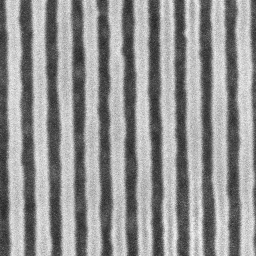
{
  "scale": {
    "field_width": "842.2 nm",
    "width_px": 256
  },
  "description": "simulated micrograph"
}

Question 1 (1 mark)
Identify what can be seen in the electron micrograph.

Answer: parallel lines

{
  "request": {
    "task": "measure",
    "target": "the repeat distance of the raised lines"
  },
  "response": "84.1 nm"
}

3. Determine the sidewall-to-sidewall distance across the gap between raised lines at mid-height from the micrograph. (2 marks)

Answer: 41.5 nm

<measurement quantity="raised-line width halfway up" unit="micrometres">0.0415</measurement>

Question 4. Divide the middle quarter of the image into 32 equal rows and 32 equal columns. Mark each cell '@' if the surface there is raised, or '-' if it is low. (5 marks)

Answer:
@@---@@@---@@@@---@@@---@@@----@
@@---@@@---@@@@---@@@---@@@----@
@@----@@---@@@@---@@@----@@----@
@@----@@----@@@---@@@----@@----@
@@---@@@@---@@@---@@@----@@----@
@@---@@@@---@@@---@@@----@@----@
@@---@@@----@@@---@@@----@@----@
@@----@@---@@@@---@@@----@@----@
@@----@@---@@@@---@@@---@@@@---@
@@----@@---@@@@---@@@---@@@@---@
@@----@@---@@@@---@@@---@@@@---@
@@----@@---@@@@---@@@---@@@@---@
@@----@@----@@@---@@@---@@@@---@
@@----@@@---@@@---@@@---@@@@---@
@@----@@@---@@@---@@@----@@@---@
@@---@@@@---@@@---@@@----@@@---@
@@---@@@@---@@@---@@@----@@@---@
@@---@@@@---@@@---@@@----@@@---@
@@---@@@@---@@@---@@@----@@@---@
@@---@@@@---@@@---@@@----@@@---@
@@----@@@---@@@---@@@----@@@---@
@@----@@@---@@@---@@@----@@@---@
@@----@@@---@@@---@@@----@@@---@
@@----@@----@@@---@@@----@@@---@
@@----@@----@@@----@@@---@@@---@
@@---@@@@---@@@----@@@---@@@---@
@@----@@@---@@@----@@@---@@@---@
@@----@@@---@@@----@@@---@@@---@
@@----@@@---@@@----@@@---@@@---@
@@---@@@@---@@@---@@@@---@@@----
@@---@@@@---@@@---@@@@---@@@----
@@---@@@@---@@@---@@@@---@@@----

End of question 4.